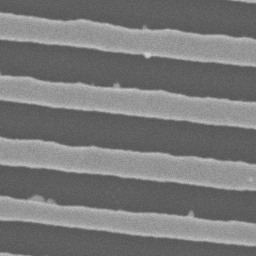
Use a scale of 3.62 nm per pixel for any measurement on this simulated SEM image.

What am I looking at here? lines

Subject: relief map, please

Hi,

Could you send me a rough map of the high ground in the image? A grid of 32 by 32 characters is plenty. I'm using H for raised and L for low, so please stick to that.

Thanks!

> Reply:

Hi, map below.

LLLLLLLLLLLLLLLLLLLLLLLLLLLLLLLL
LLLLLLLLLLLLLLLLLLLLLLLLLLLLLLLL
HHHHHHHLLLHLLLLLLLLLLLLLLLLLLLLL
HHHHHHHHHHHHHHHHLLLLLLLLLLLLLLLL
HHHHHHHHHHHHHHHHHHHHHHHHHHHHLLLL
LLLLLHHHHHHHHHHHHHHHHHHHHHHHHHHH
LLLLLLLLLLLLLLLHHHHHHHHHHHHHHHHH
LLLLLLLLLLLLLLLLLLLLLLLLHHHHHHHH
LLLLLLLLLLLLLLLLLLLLLLLLLLLLLLLL
LLLLLLLLLLLLLLLLLLLLLLLLLLLLLLLL
HHHHHHHHHHHLLLLLLLLLLLLLLLLLLLLL
HHHHHHHHHHHHHHHHHHHHHLLLLLLLLLLL
HHHHHHHHHHHHHHHHHHHHHHHHHHHHLLLL
LLLLLLLLHHHHHHHHHHHHHHHHHHHHHHHH
LLLLLLLLLLLLLLLLLHHHHHHHHHHHHHHH
LLLLLLLLLLLLLLLLLLLLLLLLLLHHHHHH
LLLLLLLLLLLLLLLLLLLLLLLLLLLLLLLL
HHLLLLLLLLLLLLLLLLLLLLLLLLLLLLLL
HHHHHHHHHHHHLLLLLLLLLLLLLLLLLLLL
HHHHHHHHHHHHHHHHHHHHHHLLLLLLLLLL
HHHHHHHHHHHHHHHHHHHHHHHHHHHHHHHL
LLLLLLLLLHHHHHHHHHHHHHHHHHHHHHHH
LLLLLLLLLLLLLLLLLLLHHHHHHHHHHHHH
LLLLLLLLLLLLLLLLLLLLLLLLLLLHHHHH
LLLLLLLLLLLLLLLLLLLLLLLLLLLLLLLL
HHHHHHLLLLLLLLLLLLLLLLLLLLLLLLLL
HHHHHHHHHHHHHHHHLLLLLLLLLLLLLLLL
HHHHHHHHHHHHHHHHHHHHHHHHHHLLLLLL
LLLLLLLLLLHHHHHHHHHHHHHHHHHHHHHH
LLLLLLLLLLLLLLLLLLLHHHHHHHHHHHHH
LLLLLLLLLLLLLLLLLLLLLLLLLLLLLHHH
LLLLLLLLLLLLLLLLLLLLLLLLLLLLLLLL